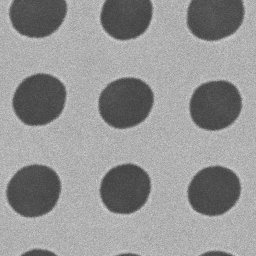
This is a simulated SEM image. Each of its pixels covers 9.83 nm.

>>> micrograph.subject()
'holes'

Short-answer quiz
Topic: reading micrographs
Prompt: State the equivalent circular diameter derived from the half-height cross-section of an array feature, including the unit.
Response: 527 nm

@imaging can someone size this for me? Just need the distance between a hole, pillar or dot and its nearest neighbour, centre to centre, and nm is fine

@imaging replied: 845